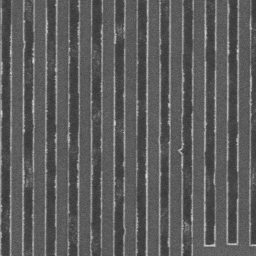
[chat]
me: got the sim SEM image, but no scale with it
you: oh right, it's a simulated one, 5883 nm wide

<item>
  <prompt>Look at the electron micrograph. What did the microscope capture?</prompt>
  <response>parallel lines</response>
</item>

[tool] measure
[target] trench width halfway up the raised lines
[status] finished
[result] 267 nanometers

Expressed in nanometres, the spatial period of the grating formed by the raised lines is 521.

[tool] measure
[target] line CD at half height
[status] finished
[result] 250 nm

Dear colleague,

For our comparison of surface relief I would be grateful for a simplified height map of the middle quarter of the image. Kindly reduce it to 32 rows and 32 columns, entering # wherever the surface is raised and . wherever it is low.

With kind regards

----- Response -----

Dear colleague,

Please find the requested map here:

.###...##....##...###...##....##
.###...##....##...###...##....##
.###...##....##...###...##....##
.###...##....##...###...##....##
.###...##....##...###...##....##
.###...##....##...###...##....##
.###...##....##...###...##....##
.###...##....##...###...##....##
.###...##....##...###...##....##
.###...##....##...###...##....##
.###...##....##...###...##....##
.###...##....##...###...###...##
.###...##....##...###...###...##
.###...##....##...###...###..###
.###...##....##...###...###..###
.###...##....##...###...###..###
.###...##....##...###...###..###
.###...##....##...###...###..###
.###...##....##...###...###..###
.###...##....##...###...###..###
.###...##....##...###...###..###
.###...##....##...###...###..###
.###...##....##...###...###..###
.###...##....##...###...##...###
.###...##....##...###...##...###
.###...##....##...###...##...###
.###...##....##...###...##...###
.###...##....##...###...##...###
.###...##....##...###...##...###
.###...##....##...###...##....##
.###...##....##...###...##....##
.###...##....##...###...##....##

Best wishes